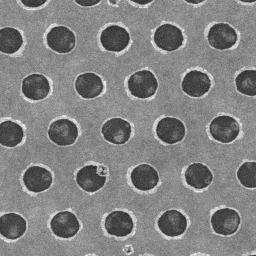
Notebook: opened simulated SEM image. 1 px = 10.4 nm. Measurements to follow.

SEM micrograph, a regular array of holes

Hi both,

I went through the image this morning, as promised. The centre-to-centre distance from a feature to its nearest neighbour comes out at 554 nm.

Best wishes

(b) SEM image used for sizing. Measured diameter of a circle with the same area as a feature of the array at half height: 28.5 px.